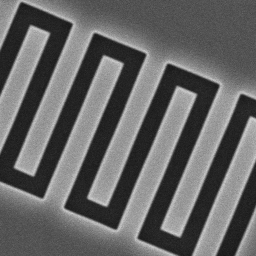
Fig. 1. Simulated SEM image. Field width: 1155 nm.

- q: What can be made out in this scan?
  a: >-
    groups of lines, slits or small figures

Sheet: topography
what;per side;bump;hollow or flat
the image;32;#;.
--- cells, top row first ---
################################
##....##########################
##......########################
#...#....#######################
#..###...###.###################
...###..###....#################
..###...###.......##############
..###..###...#....##############
..##...###..###...###..#########
.###...##...###..###.....#######
.###..###..###...###.......#####
###...###..###..###...##...#####
###..###...###..###..###...###..
##...###..###...##...###..###...
##..###...###..###...##...###...
##..###..###...###..###...###..#
#...###..###..###...###..###..##
#..###...##...###..###...###..##
...###..###..###...###..###...##
..###...###..###..###...###..###
..###..###...###..###..###...###
...#...###..###...###..###..###.
......###...###..###...###..###.
##....###..###...###..###...###.
####..###..###..###...###..###..
########........###..###...###..
#########.......##...###..###...
###########....###...##...###..#
##############.###..###...##...#
#################........###..##
###################......###..##
#####################...###...##